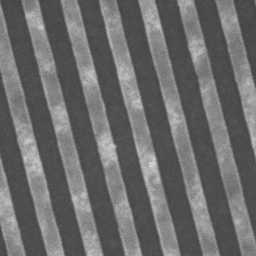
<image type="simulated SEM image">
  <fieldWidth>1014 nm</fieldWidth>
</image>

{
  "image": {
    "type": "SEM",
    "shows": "parallel lines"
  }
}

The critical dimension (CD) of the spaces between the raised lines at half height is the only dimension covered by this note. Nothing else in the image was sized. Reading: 0.0863 microns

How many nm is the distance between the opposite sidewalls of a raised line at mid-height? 61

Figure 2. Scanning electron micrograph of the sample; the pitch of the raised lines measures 149 nanometres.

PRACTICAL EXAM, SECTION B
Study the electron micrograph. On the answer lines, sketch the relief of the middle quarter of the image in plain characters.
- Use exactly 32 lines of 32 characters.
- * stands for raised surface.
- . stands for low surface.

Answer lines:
...****......****......****.....
....****.....****......****.....
....****......****.....****.....
....****......****......***.....
....****......****......****....
.....****.....****......****....
.....****......****.....****....
.....****......****......****...
.....****......****......****...
......****.....****......****...
......****......****.....****...
*.....****......****......****..
*.....****......****......****..
*......****.....****......****..
*......****......***......****..
*......****......****......****.
**.....****......****......****.
**......****.....****......****.
**......****......****.....****.
**......****......****......****
***......****.....****......****
***......****.....*****.....****
***......****......****.....****
***......****......****......***
****......***......****......***
****......****.....****......***
****......****.....*****.....***
.***......****......*..*......**
.****......***......*..*......**
.****......****.....*.**......**
.****......****......****.....**
..***......****......****......*